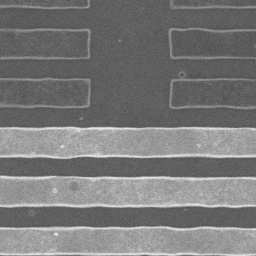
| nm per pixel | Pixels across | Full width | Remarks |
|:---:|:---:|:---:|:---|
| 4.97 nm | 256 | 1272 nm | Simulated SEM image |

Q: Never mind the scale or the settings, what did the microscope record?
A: wiring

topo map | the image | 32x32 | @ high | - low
@@@@@@@@@@@-----------@@@@@@@@@@
--------------------------------
--------------------------------
--------------------------------
@@@@@@@@@@@----------@@@@@@@@@@@
@@@@@@@@@@@----------@@@@@@@@@@@
@@@@@@@@@@@----------@@@@@@@@@@@
--------------------------------
--------------------------------
--------------------------------
@@@@@@@@@@@----------@@@@@@@@@@@
@@@@@@@@@@@----------@@@@@@@@@@@
@@@@@@@@@@@----------@@@@@@@@@@@
--------------------------------
--------------------------------
--------------------------------
@@@@@@@@@@@@@@@@@@@@@@@@@@@@@@@@
@@@@@@@@@@@@@@@@@@@@@@@@@@@@@@@@
@@@@@@@@@@@@@@@@@@@@@@@@@@@@@@@@
@@---@@@@@--@---@@@@@------@@@@-
--------------------------------
--------------------------------
@@@@@@@@@@@@@@@@@@@@@@@@@@@@@@@@
@@@@@@@@@@@@@@@@@@@@@@@@@@@@@@@@
@@@@@@@@@@@@@@@@@@@@@@@@@@@@@@@@
@@@@@@@@@@@@@@@@@@@@@@@@@@@@@@@@
--------------------------------
--------------------------------
-------------------@@-----------
@@@@@@@@@@@@@@@@@@@@@@@@@@@@@@@@
@@@@@@@@@@@@@@@@@@@@@@@@@@@@@@@@
@@@@@@@@@@@@@@@@@@@@@@@@@@@@@@@@